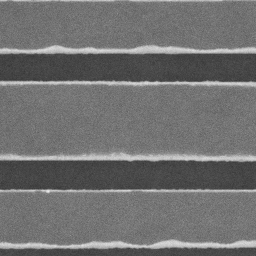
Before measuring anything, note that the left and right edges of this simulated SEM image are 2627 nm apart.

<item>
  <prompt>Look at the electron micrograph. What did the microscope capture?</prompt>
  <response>lines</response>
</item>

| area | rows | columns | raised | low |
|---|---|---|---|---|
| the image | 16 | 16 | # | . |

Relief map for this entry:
################
################
################
................
................
################
################
################
################
################
................
................
################
################
################
................